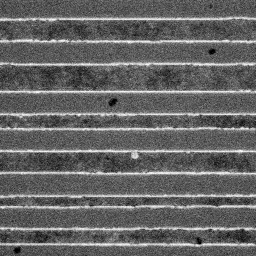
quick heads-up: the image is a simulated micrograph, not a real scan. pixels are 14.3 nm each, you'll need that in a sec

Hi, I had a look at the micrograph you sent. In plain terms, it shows lines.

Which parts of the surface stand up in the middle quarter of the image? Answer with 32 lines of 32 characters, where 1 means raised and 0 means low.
00000000000000000000000000000000
00000000000000000000000000000000
00000000000000000000000000000000
00000000000000000000000000000000
00000000000000000000000000000000
00000000000000000000000000000000
00000000000000000000000000000000
11111111111111111111111111111111
11111111111111111111111111111111
11111111111111111111111111111111
11111111111111111111111111111111
11111111111111111111111111111111
10010010010101111100000000000001
00000000000000000000000000000000
00000000000000000000000000000000
00000000000000000000000000000000
11111111111111111111111111111111
11111111111111111111111111111111
11111111111111111111111111111111
11111111111111111111111111111111
11111111111111111111111111111111
11111111111111111111111111111111
00000000000000000100000000000000
00000000000000000000000000000000
00000000000000000000000000000000
00000000000000000000000000000000
00000000000000000000000000000000
11111111111111111111111111111111
11111111111111111111111111111111
11111111111111111111111111111111
11111111111111111111111111111111
11111111111111111111111111111111